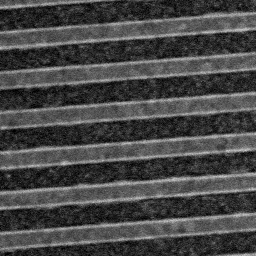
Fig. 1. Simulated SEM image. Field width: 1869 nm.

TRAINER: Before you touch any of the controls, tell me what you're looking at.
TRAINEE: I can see parallel lines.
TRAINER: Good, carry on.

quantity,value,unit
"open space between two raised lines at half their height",179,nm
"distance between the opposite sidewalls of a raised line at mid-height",0.114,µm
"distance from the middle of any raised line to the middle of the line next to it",292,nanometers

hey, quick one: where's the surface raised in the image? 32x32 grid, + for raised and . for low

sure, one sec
++++++..........................
................................
.....................+++++++++++
........++++++++++++++++++++++++
++++++++++++++++++++............
+++++++.........................
................................
......................++++++++++
........++++++++++++++++++++++++
++++++++++++++++++++............
+++++++.........................
................................
....................++++++++++++
.......+++++++++++++++++++++++++
++++++++++++++++++++............
+++++++.........................
................................
.....................+++++++++++
........++++++++++++++++++++++++
+++++++++++++++++++++...........
++++++++........................
................................
.....................+++++++++++
........++++++++++++++++++++++++
+++++++++++++++++++++...........
++++++++........................
................................
......................++++++++++
.........+++++++++++++++++++++++
+++++++++++++++++++++...........
++++++++........................
................................